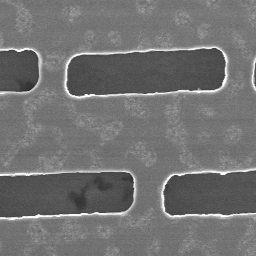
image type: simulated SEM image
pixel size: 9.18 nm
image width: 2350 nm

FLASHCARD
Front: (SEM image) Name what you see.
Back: holes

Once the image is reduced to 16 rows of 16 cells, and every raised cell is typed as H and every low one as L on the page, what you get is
HHHHHHHHHHHHHHHH
HHHHHHHHHHHHHHHH
HHHHHHHHHHHHHHHH
LLHHHLLLLLLLLLHH
LLHHLLLLLLLLLLHH
LLHHLLLLLLLLLLHH
HHHHHHHHHHHHHHHH
HHHHHHHHHHHHHHHH
HHHHHHHHHHHHHHHH
HHHHHHHHHHHHHHHH
HHHHHHHHHHHHHHHH
LLLLLLLLHHLLLLLL
LLLLLLLLHHLLLLLL
LLHHHHHHHHHHHHHH
HHHHHHHHHHHHHHHH
HHHHHHHHHHHHHHHH